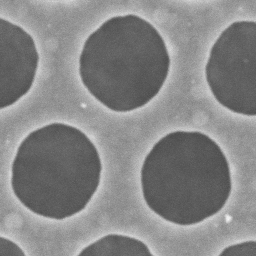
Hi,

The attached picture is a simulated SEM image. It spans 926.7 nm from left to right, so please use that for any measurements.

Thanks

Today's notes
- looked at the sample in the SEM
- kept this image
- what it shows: holes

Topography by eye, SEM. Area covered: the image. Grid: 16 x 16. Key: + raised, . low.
++++++++++++++++
.+++++...++++++.
..+++.....++++..
..+++......++...
..+++......++...
..+++.....+++...
.+++++...+++++..
++++++++++++++++
++...+++++...+++
+.....+++.....++
+.....+++.....++
+.....+++.....++
+.....+++.....++
+++.++++++...+++
++++++++++++++++
.++++....+++++..